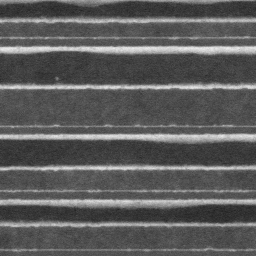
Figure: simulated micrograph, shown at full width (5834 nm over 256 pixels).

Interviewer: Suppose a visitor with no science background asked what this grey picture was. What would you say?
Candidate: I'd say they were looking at lines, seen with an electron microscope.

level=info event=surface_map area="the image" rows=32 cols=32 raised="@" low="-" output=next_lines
--------------------------------
--------------------------------
--------------------------------
@@@@@@@@@@@@@@@@@@@@@@@@@@@@@@@@
@@@@@@@@@@@@@@@@@@@@@@@@@@@@@@@@
@@@@@@@@@@@@@@@@@@@@@@@@@@@@@@@@
--------------------------------
--------------------------------
--------------------------------
--------------------------------
--------------------------------
@@@@@@@@@@@@@@@@@@@@@@@@@@@@@@@@
@@@@@@@@@@@@@@@@@@@@@@@@@@@@@@@@
@@@@@@@@@@@@@@@@@@@@@@@@@@@@@@@@
@@@@@@@@@@@@@@@@@@@@@@@@@@@@@@@@
@@@@@@@@@@@@@@@@@@@@@@@@@@@@@@@@
@@@@@@@@@@@@@@@@@@@@@@@@@@@@@@@@
--------------------------------
--------------------------------
--------------------------------
--------------------------------
@@@@@@@@@@@@@@@@@@@@@@@@@@@@@@@@
@@@@@@@@@@@@@@@@@@@@@@@@@@@@@@@@
@@@@@@@@@@@@@@@@@@@@@@@@@@@@@@@@
@@@@@@@@@@@@@@@@@@@@@@@@@@@@@@@@
--------------------------------
--------------------------------
--------------------------------
@@@@@@@@@@@@@@@@@@@@@@@@@@@@@@@@
@@@@@@@@@@@@@@@@@@@@@@@@@@@@@@@@
@@@@@@@@@@@@@@@@@@@@@@@@@@@@@@@@
@@@@@@@@@@@@@@@@@@@@@@@@@@@@@@@@